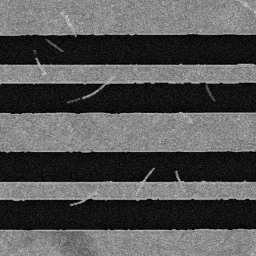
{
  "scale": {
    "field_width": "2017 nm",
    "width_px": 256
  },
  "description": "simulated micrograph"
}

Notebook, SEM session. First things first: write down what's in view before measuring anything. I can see lines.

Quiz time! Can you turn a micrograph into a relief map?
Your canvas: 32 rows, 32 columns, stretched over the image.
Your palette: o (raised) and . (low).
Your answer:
oooooooooooooooooooooooooooooooo
oooooooooooooooooooooooooooooooo
oooooooooooooooooooooooooooooooo
oooooooooooooooooooooooooooooooo
................................
................................
................................
................................
oooooooooooooooooooooooooooooooo
oooooooooooooooooooooooooooooooo
.............o..................
................................
................................
................................
oooooooooooooooooooooooooooooooo
oooooooooooooooooooooooooooooooo
oooooooooooooooooooooooooooooooo
oooooooooooooooooooooooooooooooo
oooooooooooooooooooooooooooooooo
................................
................................
................................
................................
oooooooooooooooooooooooooooooooo
oooooooooooooooooooooooooooooooo
................................
................................
................................
................................
oooooooooooooooooooooooooooooooo
oooooooooooooooooooooooooooooooo
oooooooooooooooooooooooooooooooo